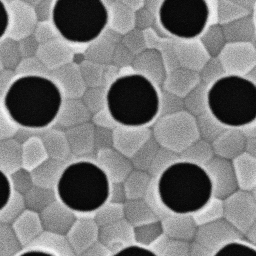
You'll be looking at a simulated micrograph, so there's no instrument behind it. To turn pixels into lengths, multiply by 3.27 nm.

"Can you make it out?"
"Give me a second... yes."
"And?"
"holes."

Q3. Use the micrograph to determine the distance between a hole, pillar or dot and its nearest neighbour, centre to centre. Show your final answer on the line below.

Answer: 99.6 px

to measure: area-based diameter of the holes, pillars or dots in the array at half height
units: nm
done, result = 169